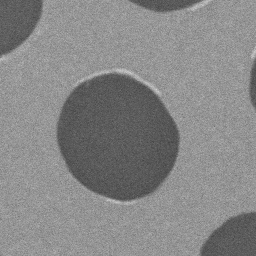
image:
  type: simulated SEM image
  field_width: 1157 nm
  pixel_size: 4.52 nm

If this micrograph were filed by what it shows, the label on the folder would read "holes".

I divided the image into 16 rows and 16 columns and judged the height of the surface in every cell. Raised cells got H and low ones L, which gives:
LLLHHHHHHLLLHHHH
LLHHHHHHHHHHHHHH
LLHHHHHHHHHHHHHH
HHHHHHHHHHHHHHHH
HHHHHHHHHHHHHHHH
HHHHHLLLLHHHHHHH
HHHHLLLLLLHHHHHH
HHHHLLLLLLLHHHHH
HHHHLLLLLLLHHHHH
HHHHLLLLLLLHHHHH
HHHHLLLLLLLHHHHH
HHHHHLLLLLHHHHHH
HHHHHHHLHHHHHHHH
HHHHHHHHHHHHHHHL
HHHHHHHHHHHHHLLL
HHHHHHHHHHHHHLLL